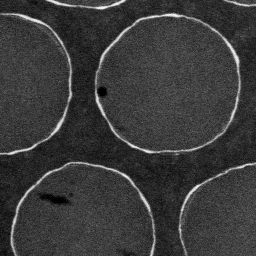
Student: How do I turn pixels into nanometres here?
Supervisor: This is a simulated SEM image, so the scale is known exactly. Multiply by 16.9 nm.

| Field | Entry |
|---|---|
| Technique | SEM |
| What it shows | holes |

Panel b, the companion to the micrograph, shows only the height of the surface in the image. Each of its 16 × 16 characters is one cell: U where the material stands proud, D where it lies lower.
UUUUUUUUUUUUUUUU
DDDUUUUUDDDDDUUU
DDDDUUUDDDDDDDUU
DDDDUUDDDDDDDDDU
DDDDUUDDDDDDDDDU
DDDDUUDDDDDDDDDU
DDDDUUDDDDDDDDDU
DDDDUUUDDDDDDDUU
DDDUUUUDDDDDDDUU
DUUUUUUUUUUUUUUU
UUUUDDDUUUUUUUUD
UUDDDDDDUUUUUDDD
UDDDDDDDDUUUDDDD
UDDDDDDDDUUDDDDD
UDDDDDDDDDUDDDDD
UDDDDDDDDDUUDDDD